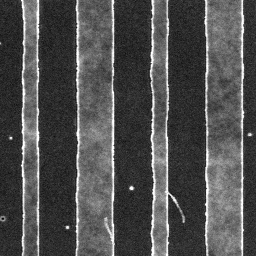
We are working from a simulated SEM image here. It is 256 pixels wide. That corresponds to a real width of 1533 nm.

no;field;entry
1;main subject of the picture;lines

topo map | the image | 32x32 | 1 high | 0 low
00011000001111000001100000111100
00011000001111000001100000111100
00011000001111000001100000111100
00011000001111000001100000111100
00011000001111000001100000111100
00011000001111000001100000111100
00011000001111000001100000111100
00011000001111000001100000111100
00011000001111000001100000111100
00011000001111000001100000111100
00011000001111000001100000111100
00011000001111000001100000111100
00011000001111000001100000111100
00011000001111000001100000111100
00011000001111000001100000111100
00011000001111000001100000111100
00011000001111000001100000111100
00011000001111000001100000111100
00011000001111000001100000111100
00011000001111000001100000111100
00011000001111000001100000111100
00011000001111000001100000111100
00011000001111000001100000111100
00011000001111000001100000111100
00011000001111000001100000111100
00011000001111000001100000111100
00011000001111000001100000111100
00011000001111000001100000111100
00011000001111000001100000111100
00011000001111000001100000111100
00011000001111000001100000111100
00011000001111000001100000111100